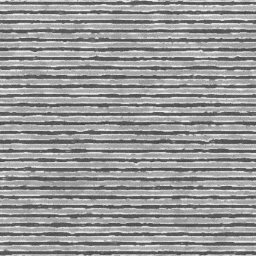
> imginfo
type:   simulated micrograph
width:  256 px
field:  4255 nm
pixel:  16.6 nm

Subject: parallel lines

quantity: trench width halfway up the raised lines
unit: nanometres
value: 79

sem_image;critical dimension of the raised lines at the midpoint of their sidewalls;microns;0.079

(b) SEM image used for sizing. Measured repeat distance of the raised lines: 154 nm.